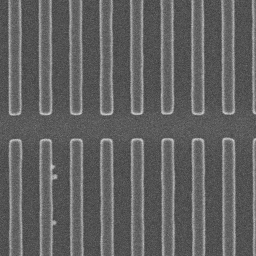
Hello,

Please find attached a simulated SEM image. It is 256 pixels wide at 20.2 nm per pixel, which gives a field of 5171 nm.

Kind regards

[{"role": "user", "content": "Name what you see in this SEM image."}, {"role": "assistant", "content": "groups of lines, slits or small figures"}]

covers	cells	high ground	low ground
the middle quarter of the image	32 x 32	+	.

..++.....+++.....+++.....++.....
..++.....+++.....+++.....++.....
..++.....+++.....++......++.....
..++.....+++.....+++.....++.....
..++.....+++.....+++.....++.....
..++.....+++.....+++.....++.....
..++.....+++.....+++.....++.....
..++.....+++.....+++.....++.....
..++.....+++.....+++.....++.....
..++.....+++.....+++.....++.....
..++.....+++.....+++.....++.....
..++.....+++.....+++.....++.....
..++......++.....++.............
................................
................................
................................
................................
................................
................................
..++.....+++.....+++.....++.....
..++.....+++.....+++.....++.....
..++.....+++.....+++.....++.....
..++.....+++.....+++.....++.....
..++.....+++.....+++.....++.....
..++.....+++.....+++.....++.....
..++.....+++.....+++.....++.....
..++.....+++.....+++.....++.....
..++.....+++.....+++.....++.....
..++.....+++.....+++.....++.....
..++.....+++.....+++.....++.....
..++.....+++.....+++.....++.....
..++.....+++.....+++.....++.....